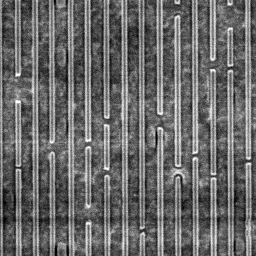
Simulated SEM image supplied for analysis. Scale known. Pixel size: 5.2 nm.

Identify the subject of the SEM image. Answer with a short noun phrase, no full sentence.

parallel lines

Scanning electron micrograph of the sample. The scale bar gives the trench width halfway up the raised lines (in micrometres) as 0.0688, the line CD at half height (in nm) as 24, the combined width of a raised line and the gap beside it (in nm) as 92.